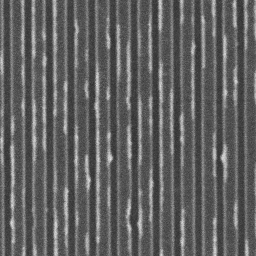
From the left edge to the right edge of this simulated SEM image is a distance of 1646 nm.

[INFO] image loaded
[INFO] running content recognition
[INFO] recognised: parallel lines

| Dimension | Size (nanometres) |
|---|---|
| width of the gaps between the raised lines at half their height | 53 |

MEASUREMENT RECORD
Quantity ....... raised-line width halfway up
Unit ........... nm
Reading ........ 82.7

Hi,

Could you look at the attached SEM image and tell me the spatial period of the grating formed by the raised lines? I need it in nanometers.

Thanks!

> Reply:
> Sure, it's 136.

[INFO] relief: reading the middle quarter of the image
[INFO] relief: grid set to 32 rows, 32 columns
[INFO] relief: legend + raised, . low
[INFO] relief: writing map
...+++..+++..+++...+++..+++..+++
...+++..+++..+++...+++..+++..+++
+..+++..+++..+++...+++..+++..+++
+..+++..+++..+++...+++..+++..+++
+..+++..+++..+++...+++..+++..+++
+..+++..+++..+++...+++..+++..+++
+..+++..+++..++++..+++..+++..+++
+..+++..+++..++++..+++..+++..+++
+..+++..+++..++++..+++..+++..+++
+..+++..+++..++++..+++..+++..+++
+..+++..+++..++++..+++..+++..+++
...+++..+++..++++..+++..+++..+++
+..+++..+++..++++..+++..+++..+++
+..+++..+++..++++..+++..+++..+++
+..+++..+++...+++..+++..+++..+++
...+++..+++...+++..+++..+++..+++
...+++..+++...+++..+++..+++..+++
...+++..++++.++++..+++..+++..+++
+..+++..++++.++++..+++..+++..+++
+..+++..+++..++++..+++..+++..+++
+..+++..+++..++++..+++..+++..+++
+..+++..++++.++++..+++..+++..+++
+..+++..++++.++++..+++..+++..+++
+..+++..++++.++++..+++..+++..+++
+..+++..++++.++++..+++..+++..+++
+..+++..+++..++++..+++..+++..+++
+..+++..+++..++++..+++..+++..+++
+..+++..+++..++++..+++..+++..+++
+..++++.+++..++++..+++..+++..+++
+..++++.+++..++++..+++..+++..+++
+..+++..+++..++++..+++..+++..+++
+..+++..+++..++++..+++..+++..+++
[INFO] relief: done